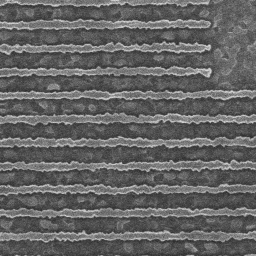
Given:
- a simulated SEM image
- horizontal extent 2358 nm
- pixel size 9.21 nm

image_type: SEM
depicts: parallel lines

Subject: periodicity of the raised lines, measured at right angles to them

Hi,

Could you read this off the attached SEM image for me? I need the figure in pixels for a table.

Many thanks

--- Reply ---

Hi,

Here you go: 23.5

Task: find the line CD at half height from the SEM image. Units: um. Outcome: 0.0668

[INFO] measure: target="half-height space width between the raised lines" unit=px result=16.2